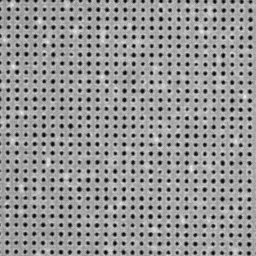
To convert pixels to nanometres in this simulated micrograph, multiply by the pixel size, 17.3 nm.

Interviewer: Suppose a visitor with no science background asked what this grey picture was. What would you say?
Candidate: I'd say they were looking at a regular array of holes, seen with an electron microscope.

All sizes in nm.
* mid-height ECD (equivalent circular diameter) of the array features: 80.4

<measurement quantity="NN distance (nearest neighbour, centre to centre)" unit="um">0.15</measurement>